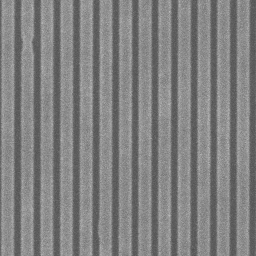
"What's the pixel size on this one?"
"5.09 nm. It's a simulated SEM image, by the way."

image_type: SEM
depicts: parallel lines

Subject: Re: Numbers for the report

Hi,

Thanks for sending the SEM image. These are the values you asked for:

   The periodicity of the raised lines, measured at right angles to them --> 99.8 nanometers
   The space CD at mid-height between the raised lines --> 40.1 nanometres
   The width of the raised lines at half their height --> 0.0599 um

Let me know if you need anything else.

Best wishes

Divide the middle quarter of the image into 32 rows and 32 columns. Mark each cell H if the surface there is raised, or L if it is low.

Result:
HHLLHHHLLHHHLLHHHLLHHHLLHHHLLHHL
HHLLHHHLLHHHLLHHHLLHHHLLHHHLLHHL
HHLLHHHLLHHHLLHHHLLHHHLLHHHLLHHL
HHLLHHHLLHHHLLHHHLLHHHLLHHHLLHHL
HHLLHHHLLHHHLLHHHLLHHHLLHHHLLHHL
HHLLHHHLLHHHLLHHHLLHHHLLHHHLLHHL
HHLLHHHLLHHHLLHHHLLHHHLLHHHLLHHL
HHLLHHHLLHHHLLHHHLLHHHLLHHHLLHHL
HHLLHHHLLHHHLLHHHLLHHHLLHHHLLHHL
HHLLHHHLLHHHLLHHHLLHHHLLHHHLLHHL
HHLLHHHLLHHHLLHHHLLHHHLLHHHLLHHL
HHLLHHHLLHHHLLHHHLLHHHLLHHHLLHHL
HHLLHHHLLHHHLLHHHLLHHHLLHHLLLHHL
HHLLHHHLLHHHLLHHHLLHHHLLHHLLLHHL
HHLLHHHLLHHHLLHHHLLHHHLLHHLLLHHL
HHLLHHHLLHHHLLHHHLLHHHLLHHLLLHHL
HHLLHHHLLHHHLLHHHLLHHHLLHHLLLHHL
HHLLHHHLLHHHLLHHHLLHHHLLHHLLLHHL
HHLLHHHLLHHHLLHHHLLHHHLLHHLLLHHL
HHLLHHHLLHHHLLHHHLLHHHLLHHLLLHHL
HHLLHHHLLHHHLLHHHLLHHHLLHHLLLHHL
HHLLHHHLLHHHLLHHHLLHHHLLHHLLLHHL
HHLLHHHLLHHHLLHHHLLHHHLLHHLLLHHL
HHLLHHHLLHHHLLHHHLLHHHLLHHLLLHHL
HHLLHHHLLHHHLLHHHLLHHHLLHHLLLHHL
HHLLHHHLLHHHLLHHHLLHHHLLHHLLLHHL
HHLLHHHLLHHHLLHHHLLHHHLLHHLLLHHL
HHLLHHHLLHHHLLHHHLLHHHLLHHLLLHHL
HHLLHHHLLHHHLLHHHLLHHHLLHHLLLHHL
HHLLHHHLLHHHLLHHHLLHHHLLHHLLLHHL
HHLLHHHLLHHHLLHHHLLHHHLLHHLLLHHL
HHLLHHHLLHHHLLHHHLLHHHLLHHLLLHHL